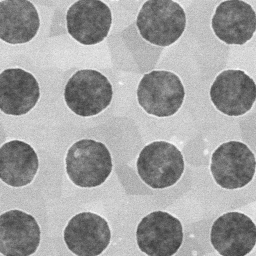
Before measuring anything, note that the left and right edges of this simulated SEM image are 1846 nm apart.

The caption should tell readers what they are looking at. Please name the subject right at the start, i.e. holes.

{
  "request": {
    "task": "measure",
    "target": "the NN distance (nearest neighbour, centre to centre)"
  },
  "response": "0.512 micrometres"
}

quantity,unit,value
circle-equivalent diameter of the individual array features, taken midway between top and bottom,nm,348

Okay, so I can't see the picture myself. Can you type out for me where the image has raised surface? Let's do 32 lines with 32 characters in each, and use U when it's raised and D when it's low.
DDDDUUUUUDDDDUUUUUDDDDUUUUUDDDDU
DDDDDUUUDDDDDDUUUDDDDDDUUUUDDDDD
DDDDDUUUDDDDDDUUUDDDDDDUUUUDDDDD
DDDDDUUUDDDDDDUUUDDDDDDUUUDDDDDD
DDDDUUUUUDDDDUUUUUDDDDDUUUUDDDDD
UDDUUUUUUUDDUUUUUUUDDDUUUUUUDDUU
UUUUUUUUUUUUUUUUUUUUUUUUUUUUUUUU
UUUUUUUUUUUUUUUUUUUUUUUUUUUUUUUU
UDUUUUUUUUUUUUUUUUUUUUUUUUUUUUUU
DDDDUUUUUDDDDUUUUUDDDDUUUUUDDDDU
DDDDDUUUDDDDDDUUUDDDDDDUUUUDDDDD
DDDDDUUUDDDDDDUUUDDDDDDUUUDDDDDD
DDDDDUUUDDDDDDUUUDDDDDDUUUDDDDDD
DDDDUUUUUDDDDUUUUUDDDDDUUUUDDDDU
UUUUUUUUUUDDUUUUUUUDDUUUUUUUUDUU
UUUUUUUUUUUUUUUUUUUUUUUUUUUUUUUU
UUUUUUUUUUUUUUUUUUUUUUUUUUUUUUUU
UDUUUUUUUUDDUUUUUUUUUUUUUUUUUUUU
DDDDUUUUUDDDDUUUUUDDDDUUUUUDDDDU
DDDDDUUUDDDDDDUUUDDDDDDUUUDDDDDD
DDDDDUUUDDDDDDUUUDDDDDDUUUDDDDDD
DDDDDUUUDDDDDDUUUDDDDDDUUUDDDDDD
DDDDUUUUUDDDDUUUUUDDDDUUUUUDDDDU
UUUUUUUUUUUUUUUUUUUDDUUUUUUUDDUU
UUUUUUUUUUUUUUUUUUUUUUUUUUUUUUUU
UUUUUUUUUUUUUUUUUUUUUUUUUUUUUUUU
UDDUUUUUUUUUUUUUUUUDDUUUUUUUUDUU
DDDDUUUUUDDDDUUUUUDDDDUUUUUDDDDU
DDDDDUUUDDDDDDUUUDDDDDDUUUDDDDDD
DDDDDUUUDDDDDDUUUDDDDDDUUUDDDDDD
DDDDDUUUDDDDDDUUUDDDDDDUUUDDDDDD
DDDDUUUUUDDDDUUUUUDDDDUUUUUDDDDU